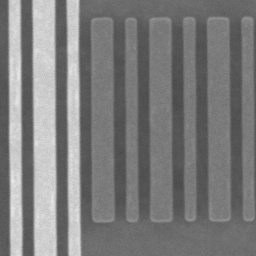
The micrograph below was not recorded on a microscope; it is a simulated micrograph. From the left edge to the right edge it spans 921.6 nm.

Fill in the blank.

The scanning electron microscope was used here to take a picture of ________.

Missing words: groups of lines, slits or small figures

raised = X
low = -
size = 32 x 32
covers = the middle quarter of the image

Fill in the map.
-XX----XXXXX----XX----XXXXX---XX
-XX----XXXXX----XX----XXXXX---XX
-XX----XXXXX----XX---XXXXXX---XX
-XX----XXXXX----XX---XXXXXX---XX
-XX----XXXXX----XX---XXXXXX---XX
-XXX---XXXXX----XX---XXXXXX---XX
-XXX---XXXXX----XX---XXXXXX---XX
-XXX---XXXXX----XX---XXXXXX---XX
-XXX---XXXXX----XX---XXXXXX---XX
-XXX---XXXXX----XX---XXXXXX---XX
-XXX---XXXXX----XX---XXXXXX---XX
-XXX---XXXXX----XX---XXXXXX---XX
-XXX---XXXXX----XX---XXXXXX---XX
-XXX---XXXXX----XX----XXXXX---XX
-XXX---XXXXX----XX----XXXXX---XX
-XXX---XXXXX----XX----XXXXX---XX
-XXX---XXXXX----XX----XXXXX---XX
-XXX---XXXXX----XX----XXXXX---XX
-XXX---XXXXX----XX----XXXXX---XX
-XXX---XXXXX----XX----XXXXX---XX
-XXX---XXXXX----XX----XXXXX---XX
-XXX---XXXXX----XX----XXXXX---XX
-XXX---XXXXX----XX----XXXXX---XX
-XXX---XXXXX----XX----XXXXX---XX
-XXX---XXXXX----XX----XXXXX---XX
-XXX---XXXXX----XX----XXXXX---XX
-XXX---XXXXX----XX----XXXXX---XX
-XXX---XXXXX----XX----XXXXX---XX
-XXX---XXXXX----XX----XXXXX---XX
-XXX---XXXXX----XX----XXXXX---XX
-XXX---XXXXX----XX----XXXXX---XX
-XXX---XXXXX----XX----XXXXX---XX